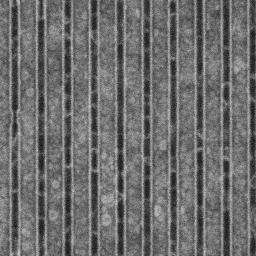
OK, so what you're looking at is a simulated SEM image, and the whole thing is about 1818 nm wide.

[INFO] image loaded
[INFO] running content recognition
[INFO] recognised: parallel lines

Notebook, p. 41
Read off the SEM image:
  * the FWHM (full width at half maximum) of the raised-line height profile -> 66.5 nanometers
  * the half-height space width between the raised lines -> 0.12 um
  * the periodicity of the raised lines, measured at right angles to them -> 0.188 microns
